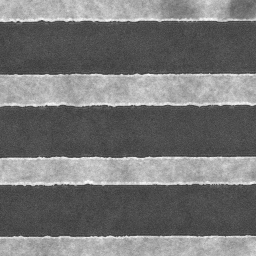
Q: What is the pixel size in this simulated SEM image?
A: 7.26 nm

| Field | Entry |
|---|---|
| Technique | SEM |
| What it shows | lines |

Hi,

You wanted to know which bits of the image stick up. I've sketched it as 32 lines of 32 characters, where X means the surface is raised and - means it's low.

XXXXXXXXXXXXXXXXXXXXXXXXXXXXXXXX
XXXXXXXXXXXXXXXXXXXXXXXXXXXXXXXX
XXXXXXXXXXXXXXXXXXXXXXXXXXXXXXXX
--------------------------------
--------------------------------
--------------------------------
--------------------------------
--------------------------------
--------------------------------
XXXXXXXXXXXXXXXXXXXXXXXXXXXXXXXX
XXXXXXXXXXXXXXXXXXXXXXXXXXXXXXXX
XXXXXXXXXXXXXXXXXXXXXXXXXXXXXXXX
XXXXXXXXXXXXXXXXXXXXXXXXXXXXXXXX
--------------------------------
--------------------------------
--------------------------------
--------------------------------
--------------------------------
--------------------------------
--------------------------------
XXXXXXXXXXXXXXXXXXXXXXXXXXXXXXXX
XXXXXXXXXXXXXXXXXXXXXXXXXXXXXXXX
XXXXXXXXXXXXXXXXXXXXXXXXXXXXXXXX
--------------------------------
--------------------------------
--------------------------------
--------------------------------
--------------------------------
--------------------------------
------------------------------XX
XXXXXXXXXXXXXXXXXXXXXXXXXXXXXXXX
XXXXXXXXXXXXXXXXXXXXXXXXXXXXXXXX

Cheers